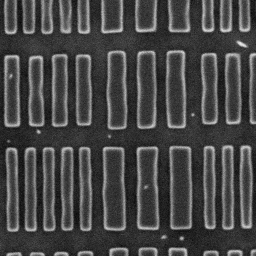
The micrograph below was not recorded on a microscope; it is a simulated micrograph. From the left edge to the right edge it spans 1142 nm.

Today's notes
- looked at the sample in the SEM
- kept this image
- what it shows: groups of lines, slits or small figures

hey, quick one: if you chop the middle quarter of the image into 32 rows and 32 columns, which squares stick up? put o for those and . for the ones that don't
o..ooo.....oooo....oooo...oooo..
o..ooo.....oooo...ooooo...oooo..
o..ooo.....oooo...ooooo...oooo..
o..ooo.....oooo....oooo...oooo..
o..oooo....oooo....oooo...oooo..
o..oooo....oooo....oooo...oooo..
o..oooo....oooo....oooo...oooo..
o..oooo....oooo....oooo...oooo..
o..oooo....oooo....oooo...oooo..
...oooo....oooo....oooo...oooo..
o..oooo....ooooo...oooo...oooo..
o..oooo....ooooo...oooo...oooo..
o..oooo....ooooo...oooo...oooo..
o..oooo....ooooo...oooo...oooo..
o..oooo....oooo....oooo...oooo..
...........oooo....ooo....oooo..
................................
................................
................................
................................
................................
oo..oo....ooooo....oooo....ooooo
oo..oo....ooooo....oooo....ooooo
oo..oo....ooooo....oooo....ooooo
oo..oo....ooooo....oooo....ooooo
oo..ooo...ooooo....oooo....ooooo
oo..ooo...ooooo....oooo....ooooo
oo..ooo...ooooo....oooo....ooooo
oo..oo....ooooo....oooo....ooooo
oo..oo....ooooo....oooo....ooooo
oo..ooo...ooooo....oooo....ooooo
oo..ooo...ooooo....oooo....ooooo